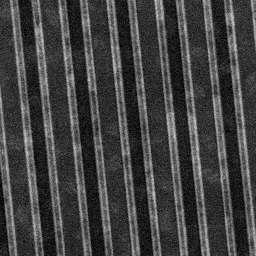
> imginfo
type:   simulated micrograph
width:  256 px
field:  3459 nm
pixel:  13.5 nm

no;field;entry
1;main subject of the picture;parallel lines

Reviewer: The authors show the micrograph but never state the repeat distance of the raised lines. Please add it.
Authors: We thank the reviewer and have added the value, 321 nanometres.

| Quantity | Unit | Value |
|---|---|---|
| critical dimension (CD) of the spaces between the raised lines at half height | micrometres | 0.205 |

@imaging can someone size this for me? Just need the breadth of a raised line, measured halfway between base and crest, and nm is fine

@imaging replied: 79